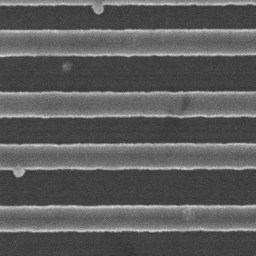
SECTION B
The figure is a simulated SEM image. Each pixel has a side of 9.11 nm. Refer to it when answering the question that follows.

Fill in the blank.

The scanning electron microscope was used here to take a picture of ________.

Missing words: lines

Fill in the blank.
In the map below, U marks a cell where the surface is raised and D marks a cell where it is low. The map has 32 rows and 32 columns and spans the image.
UUUUUUUUUUUUUDUUDUUUUUUUUUUUUDDU
DDDDDDDDDDDDUDDDDDDDDDDDDDDDDDDD
DDDDDDDDDDDDDDDDDDDDDDDDDDDDDDDD
DDDDDDDDDDDDDDDDDDDDDDDDDDDDDDDD
UUUUUUUUUUUUUUUUUUUUUUUUUUUUUUUU
UUUUUUUUUUUUUUUUUUUUUUUUUUUUUUUU
UUUUUUUUUUUUUUUUUUUUUUUUUUUUUUUU
DDDDDDDDDDDDDDDDDDDDDDDDDDDDDDDD
DDDDDDDDDDDDDDDDDDDDDDDDDDDDDDDD
DDDDDDDDDDDDDDDDDDDDDDDDDDDDDDDD
DDDDDDDDDDDDDDDDDDDDDDDDDDDDDDDD
DDDDDDDDDDDDDDDDDDDDDDDDDDDDDDDD
UUUUUUUUUUUUUUUUUUUUUUUUUUUUUUUU
UUUUUUUUUUUUUUUUUUUUUUUUUUUUUUUU
UUUUUUUUUUUUUDDDDDDUUDUUDUUDUDDU
DDDDDDDDDDDDDDDDDDDDDDDDDDDDDDDD
DDDDDDDDDDDDDDDDDDDDDDDDDDDDDDDD
DDDDDDDDDDDDDDDDDDDDDDDDDDDDDDDD
UUUUUUUUUUUUUUUUUUUUUUUUUUUUUUUU
UUUUUUUUUUUUUUUUUUUUUUUUUUUUUUUU
UUUUUUUUUUUUUUUUUUUUUUUUUUUUUUUU
DDUDDDDDDDDDDDDDDDDDDDDDDDDDDDDD
DDDDDDDDDDDDDDDDDDDDDDDDDDDDDDDD
DDDDDDDDDDDDDDDDDDDDDDDDDDDDDDDD
DDDDDDDDDDDDDDDDDDDDDDDDDDDDDDDD
DDDDDDDDDDDDDDDDDDDDDDDDDDDDDDDD
UUUUUUUUUUUUUUUUUUUUUUUUUUUUUUUU
UUUUUUUUUUUUUUUUUUUUUUUUUUUUUUUU
UUUUUUUUUUUUUUUUUUUUUUUUUUUUUUUU
DDDDDDDDDDDDDDDDDDDDDDDDDDDDDDDD
DDDDDDDDDDDDDDDDDDDDDDDDDDDDDDDD
DDDDDDDDDDDDDDDDDDDDDDDDDDDDDDDD